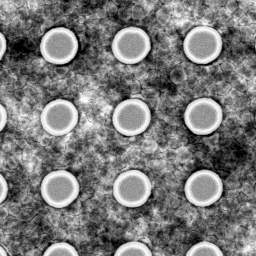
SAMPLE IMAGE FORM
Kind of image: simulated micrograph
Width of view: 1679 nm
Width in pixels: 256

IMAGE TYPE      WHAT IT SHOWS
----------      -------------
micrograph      a regular array of raised bodies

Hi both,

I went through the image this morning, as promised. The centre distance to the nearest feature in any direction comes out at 468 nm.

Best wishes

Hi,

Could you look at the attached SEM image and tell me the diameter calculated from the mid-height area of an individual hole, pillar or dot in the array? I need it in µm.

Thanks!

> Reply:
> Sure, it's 0.226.